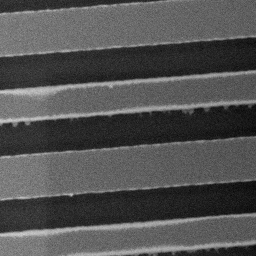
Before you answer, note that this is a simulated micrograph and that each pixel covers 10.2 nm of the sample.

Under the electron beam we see lines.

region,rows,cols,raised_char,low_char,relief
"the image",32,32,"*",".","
...............*****************
..******************************
********************************
********************************
********************************
********************............
*******.........................
................................
................................
.......................*********
..........**********************
********************************
********************************
***********************.........
***********.....................
................................
................................
............................****
..............******************
.*******************************
********************************
********************************
********************************
*******************.............
******..........................
................................
................................
.....................***********
.........***********************
********************************
********************************
******************..............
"